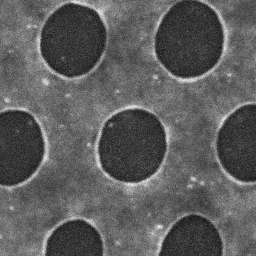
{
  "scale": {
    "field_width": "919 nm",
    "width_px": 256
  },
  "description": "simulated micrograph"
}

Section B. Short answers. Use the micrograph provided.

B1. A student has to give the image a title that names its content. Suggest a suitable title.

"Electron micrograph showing holes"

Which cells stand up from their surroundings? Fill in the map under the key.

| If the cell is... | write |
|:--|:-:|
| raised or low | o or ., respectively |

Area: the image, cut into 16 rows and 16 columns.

oooo..ooooo..ooo
ooo....ooo....oo
ooo....ooo....oo
ooo...oooo....oo
ooo...ooooo..ooo
oooooooooooooooo
ooooooooooooooo.
..ooooo...oooo..
...ooo....oooo..
...ooo....oooo..
..oooo....oooo..
.ooooooooooooooo
oooooooooooooooo
oooooooooooo.ooo
ooo...oooo....oo
ooo...oooo....oo